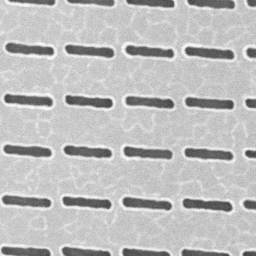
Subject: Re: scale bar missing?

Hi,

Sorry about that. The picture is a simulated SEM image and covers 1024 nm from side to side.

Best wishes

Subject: a regular array of holes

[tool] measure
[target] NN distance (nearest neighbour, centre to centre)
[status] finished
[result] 202 nm